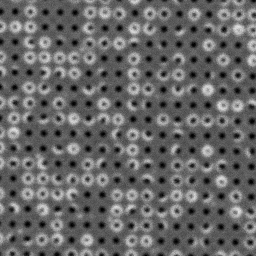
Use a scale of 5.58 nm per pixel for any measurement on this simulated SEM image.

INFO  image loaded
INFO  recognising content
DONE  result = a regular array of holes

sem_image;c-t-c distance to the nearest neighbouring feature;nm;81.9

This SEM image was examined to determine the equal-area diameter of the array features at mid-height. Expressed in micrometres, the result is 0.0362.